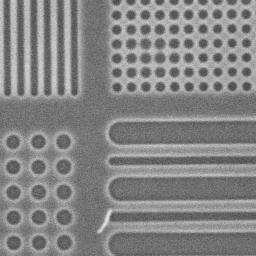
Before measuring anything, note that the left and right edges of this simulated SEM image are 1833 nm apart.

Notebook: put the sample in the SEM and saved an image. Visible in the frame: groups of lines, slits or small figures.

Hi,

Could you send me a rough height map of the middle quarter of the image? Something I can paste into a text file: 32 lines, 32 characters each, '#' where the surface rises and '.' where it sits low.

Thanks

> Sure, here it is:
#...############################
#...########..##..#...#..#...#..
....########......#..........#..
....#########.######.###########
....################.##..##.###.
....########..##..#...#..#...#..
....########..##..#...#..#...#..
##.#############################
################################
################################
################################
################################
################################
################################
#############...................
############....................
###########.....................
###########.....................
..#########.....................
..##########....................
..############.#################
################################
################################
###########.....................
.##########.....................
..##########.........###########
..##############################
.###############################
#############...................
############....................
.##########.....................
..#########.....................